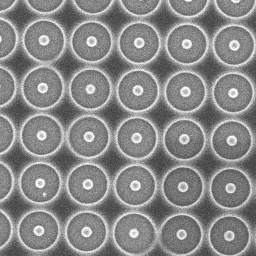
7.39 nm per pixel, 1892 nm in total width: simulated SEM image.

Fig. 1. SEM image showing an array of small figures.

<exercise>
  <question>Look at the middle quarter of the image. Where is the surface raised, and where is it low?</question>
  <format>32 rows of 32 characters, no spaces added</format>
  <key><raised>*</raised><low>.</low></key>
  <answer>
********************************
******..**********.*************
***.......******......******....
**.........****.......*****.....
**.........***.........***......
**.........***.........***......
**....*.....**...***....*....**.
**.........**.....*....**....**.
**.........***.........***......
***.......****.........***......
****.....******.......*****.....
*****************...*********...
********************************
****....**********.*************
***.......*****......*******....
**........****........*****.....
*..........***.........***......
*....**....**....*.....**.......
*....**....**....**....**....**.
*..........**.....*....**....**.
*..........***.........**.......
**........****........****......
***......******......******.....
*****************...********....
********************************
****....*********..*************
**.......******......******.....
**........****........****......
*..........**.........***.......
*....**....**....*.....**.......
*....**....**....**....**....**.
*..........**..........**....**.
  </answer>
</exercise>